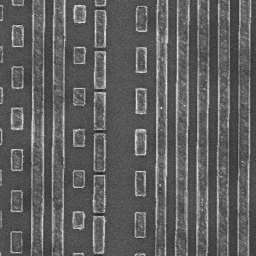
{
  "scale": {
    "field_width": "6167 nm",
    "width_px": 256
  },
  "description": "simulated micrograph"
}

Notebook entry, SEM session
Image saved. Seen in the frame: wiring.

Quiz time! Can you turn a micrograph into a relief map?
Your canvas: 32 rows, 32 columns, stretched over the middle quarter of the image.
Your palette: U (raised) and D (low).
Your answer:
DDDDDDDDUUDDDDDDDDUUDDDUUUDDUUUD
DDDDDDDDUUDDDDDDDDUUDDDUUUDDUUUD
DDDDDDDDUUDDDDDDDDDDDDDUUUDDUUUD
DDDDDDDDUUDDDDDDDDDDDDDUUUDDUUUD
DDDDDDDDUUDDDDDDDDDDDDDUUUDDUUUD
DDDDDDDDUUDDDDDDDDDDDDDUUUDDUUUD
DDDUUDDDDDDDDDDDDDUUDDDUUUDDUUUD
DDDUUDDDUUDDDDDDDDUUDDDUUUDDUUUD
DDDUUDDDUUDDDDDDDDUUDDDUUUDDUUUD
DDDUUDDDUUDDDDDDDDUUDDDUUUDDUUUD
DDDDDDDDUUDDDDDDDDUUDDDUUUDDUUUD
DDDDDDDDUUDDDDDDDDUUDDDUUUDDUUUD
DDDDDDDDUUDDDDDDDDDDDDDUUUDDUUUD
DDDDDDDDUUDDDDDDDDDDDDDUUUDDUUUD
DDDDDDDDUUDDDDDDDDDDDDDUUUDDUUUD
DDDDDDDDUUDDDDDDDDDDDDDUUUDDUUUD
DDDDDDDDDDDDDDDDDDDDDDDUUUDDUUUD
DDDUUDDDUUDDDDDDDDUUDDDUUUDDUUUD
DDDUUDDDUUDDDDDDDDUUDDDUUUDDUUUD
DDDUUDDDUUDDDDDDDDUUDDDUUUDDUUUD
DDDDDDDDUUDDDDDDDDUUDDDUUUDDUUUD
DDDDDDDDUUDDDDDDDDUUDDDUUUDDUUUD
DDDDDDDDUUDDDDDDDDUUDDDUUUDDUUUD
DDDDDDDDUUDDDDDDDDDDDDDUUUDDUUUD
DDDDDDDDUUDDDDDDDDDDDDDUUUDDUUUD
DDDDDDDDUUDDDDDDDDDDDDDUUUDDUUUD
DDDDDDDDUUDDDDDDDDDDDDDUUDDDUUUD
DDUUUDDDDDDDDDDDDDUUDDDUUDDDUUUD
DDUUUDDDUUDDDDDDDDUUDDDUUDDDUUUD
DDUUUDDDUUDDDDDDDDUUDDDUUDDDUUUD
DDDUUDDDUUDDDDDDDDUUDDDUUDDDUUUD
DDDDDDDDUUDDDDDDDDUUDDDUUDDDUUUD